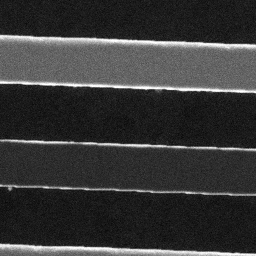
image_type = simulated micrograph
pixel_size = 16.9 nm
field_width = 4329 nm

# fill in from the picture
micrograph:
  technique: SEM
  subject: lines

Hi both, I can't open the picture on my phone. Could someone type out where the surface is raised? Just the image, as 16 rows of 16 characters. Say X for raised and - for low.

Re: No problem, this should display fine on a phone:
----------------
----------------
XXX-------------
XXXXXXXXXXXXXXXX
XXXXXXXXXXXXXXXX
---------XXXXXXX
----------------
----------------
----------------
XXXXXXXXXXXXXXXX
XXXXXXXXXXXXXXXX
XXXXXXXXXXXXXXXX
----------------
----------------
----------------
XXX-------------